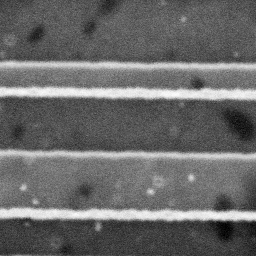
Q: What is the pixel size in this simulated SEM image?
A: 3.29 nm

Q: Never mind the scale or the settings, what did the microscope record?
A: lines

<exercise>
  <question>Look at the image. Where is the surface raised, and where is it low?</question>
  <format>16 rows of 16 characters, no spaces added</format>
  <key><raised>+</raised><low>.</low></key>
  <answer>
................
................
................
................
++++++++++++++++
++++++++++++++++
................
................
................
++..............
++++++++++++++++
++++++++++++++++
++++++++++++++++
++++++++++++++++
................
................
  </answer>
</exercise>